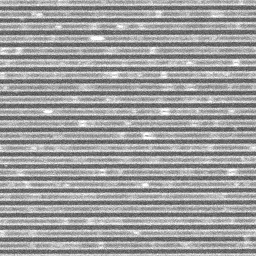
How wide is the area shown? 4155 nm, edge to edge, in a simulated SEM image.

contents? parallel lines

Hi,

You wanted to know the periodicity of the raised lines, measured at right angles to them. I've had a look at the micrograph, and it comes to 198 nanometres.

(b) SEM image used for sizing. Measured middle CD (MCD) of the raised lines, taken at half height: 118 nm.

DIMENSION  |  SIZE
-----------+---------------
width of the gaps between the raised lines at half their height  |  87.3 nanometres